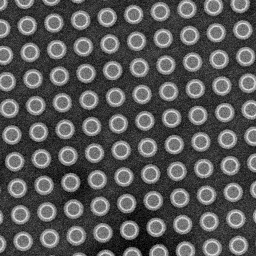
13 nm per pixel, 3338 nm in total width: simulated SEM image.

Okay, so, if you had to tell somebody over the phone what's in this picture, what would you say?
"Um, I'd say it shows an array of small figures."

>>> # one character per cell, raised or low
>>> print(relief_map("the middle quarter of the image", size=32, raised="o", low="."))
....ooo...oooo..ooooo..ooooo..oo
o..ooooo..ooooo.ooooo..ooooo...o
o..ooooo..oooo...oooo....o......
o..ooooo...ooo..................
o...ooo........................o
...................oo...oooo..oo
...........ooo...ooooo..oooo...o
....oooo...oooo..ooooo..oooo...o
oo..ooooo..oooo..ooooo..oooo....
oo..ooooo..oooo...ooo...........
oo..oooo....oo..................
o.........................oo....
...................ooo...oooo..o
......oo....oooo..oooo...oooo..o
oo...oooo..ooooo..ooooo..oooo...
ooo..oooo..ooooo..oooo...ooo....
ooo..oooo...ooo....oo...........
oo...ooo........................
o.........................ooo...
.............oo....oooo..ooooo..
......ooo...oooo...oooo..ooooo..
ooo..ooooo..ooooo..oooo...oooo..
ooo..ooooo..oooo...oooo....o....
ooo...oooo...ooo................
ooo....o....................o...
....................ooo...oooo..
.............oooo...oooo..ooooo.
.oo...oooo...oooo..ooooo..ooooo.
oooo..ooooo..oooo..ooooo...ooo..
oooo..ooooo..oooo...ooo.........
oooo...ooo....oo................
ooo.........................oo..